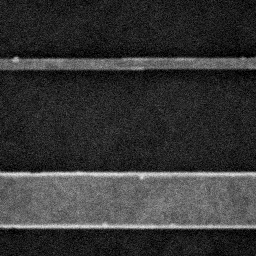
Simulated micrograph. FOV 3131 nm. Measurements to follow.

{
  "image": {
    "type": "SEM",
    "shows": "lines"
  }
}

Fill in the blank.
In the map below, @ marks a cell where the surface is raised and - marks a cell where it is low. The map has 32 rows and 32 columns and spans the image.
--------------------------------
--------------------------------
--------------------------------
--------------------------------
--------------------------------
--------------------------------
--------------------------------
@@@@@@@@@@@@@@@@@@@@@@@@@@@@@@@@
@@@@@@@@@@@@@@@@@@@@@@@@@@@@@@@@
--------------------------------
--------------------------------
--------------------------------
--------------------------------
--------------------------------
--------------------------------
--------------------------------
--------------------------------
--------------------------------
--------------------------------
--------------------------------
--------------------------------
--------------------------------
@@@@@@@@@@@@@@@@@@@@@@@@@@@@@@@@
@@@@@@@@@@@@@@@@@@@@@@@@@@@@@@@@
@@@@@@@@@@@@@@@@@@@@@@@@@@@@@@@@
@@@@@@@@@@@@@@@@@@@@@@@@@@@@@@@@
@@@@@@@@@@@@@@@@@@@@@@@@@@@@@@@@
@@@@@@@@@@@@@@@@@@@@@@@@@@@@@@@@
--------------------------------
--------------------------------
--------------------------------
--------------------------------